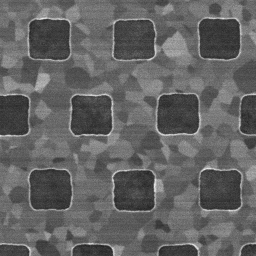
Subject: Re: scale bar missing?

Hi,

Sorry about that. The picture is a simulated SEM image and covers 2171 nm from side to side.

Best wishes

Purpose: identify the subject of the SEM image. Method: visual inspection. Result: a regular array of holes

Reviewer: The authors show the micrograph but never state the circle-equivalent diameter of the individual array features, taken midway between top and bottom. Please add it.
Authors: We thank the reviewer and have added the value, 383 nm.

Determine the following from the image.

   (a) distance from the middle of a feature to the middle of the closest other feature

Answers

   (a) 0.719 µm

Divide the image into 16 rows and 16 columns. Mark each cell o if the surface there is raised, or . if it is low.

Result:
oooooooooooooooo
oo..ooo..oooo..o
oo..ooo...oo...o
oo..ooo..oooo..o
oooooooooooooooo
oooooooooooooooo
..oo...ooo..ooo.
..oo...ooo..ooo.
oooooooooooooooo
oooooooooooooooo
oooooooooooooooo
oo..ooo...oo...o
oo..ooo...oo...o
oooooooooooooooo
oooooooooooooooo
..ooo..ooo..ooo.